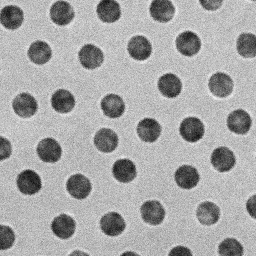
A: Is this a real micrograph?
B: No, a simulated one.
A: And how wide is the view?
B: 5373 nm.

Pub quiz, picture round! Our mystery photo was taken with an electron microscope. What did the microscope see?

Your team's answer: a regular array of holes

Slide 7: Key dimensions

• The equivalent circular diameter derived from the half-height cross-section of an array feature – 548 nanometres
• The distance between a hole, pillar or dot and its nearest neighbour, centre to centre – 878 nm